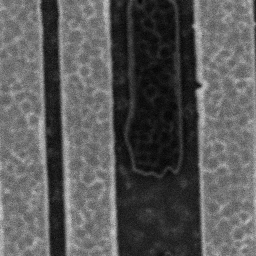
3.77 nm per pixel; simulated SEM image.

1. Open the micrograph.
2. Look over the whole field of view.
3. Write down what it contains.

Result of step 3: one or a few lines or trenches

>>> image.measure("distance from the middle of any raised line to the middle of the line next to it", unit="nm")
261